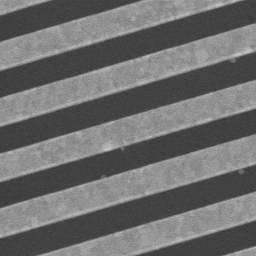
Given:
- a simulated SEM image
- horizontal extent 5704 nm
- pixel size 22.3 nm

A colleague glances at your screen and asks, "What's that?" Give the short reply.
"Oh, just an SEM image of lines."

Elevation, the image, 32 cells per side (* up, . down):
*****...........*************...
*............************.......
.........*************..........
......************............**
...************............*****
***********............*********
********............************
*****...........************....
*............************.......
.........************...........
......************............**
..*************............*****
***********............*********
********............************
*****...........*************...
*............************.......
.........*************..........
......************...........***
..*************...........******
***********............*********
********...........*************
****............*************...
*...........*************.......
.........*************..........
.....*************............**
..*************............*****
***********............*********
********............************
****............*************...
*............************.......
..........************..........
......************...........***